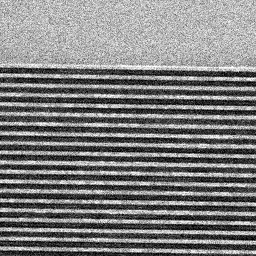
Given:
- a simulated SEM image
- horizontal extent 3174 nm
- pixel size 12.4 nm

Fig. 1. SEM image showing parallel lines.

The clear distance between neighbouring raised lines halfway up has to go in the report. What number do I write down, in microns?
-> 0.0744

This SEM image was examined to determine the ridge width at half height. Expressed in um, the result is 0.0496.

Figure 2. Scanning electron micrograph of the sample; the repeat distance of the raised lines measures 0.119 microns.